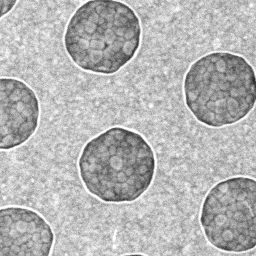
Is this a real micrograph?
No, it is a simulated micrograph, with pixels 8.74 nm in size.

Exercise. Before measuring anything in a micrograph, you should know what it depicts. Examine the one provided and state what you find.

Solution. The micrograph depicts holes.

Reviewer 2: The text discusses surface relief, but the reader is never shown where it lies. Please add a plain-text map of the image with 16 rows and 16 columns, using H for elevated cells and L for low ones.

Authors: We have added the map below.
LHHHHLLLHHHHHHHH
HHHHLLLLLHHHHHHH
HHHHLLLLLHHHHHHH
HHHHLLLLHHHHHLLH
HHHHHHLHHHHHLLLL
LLHHHHHHHHHHLLLL
LLHHHHHHHHHHLLLL
LLHHHHHHHHHHLLLH
LLHHHHLLLHHHHHHH
HHHHHLLLLLHHHHHH
HHHHHLLLLLHHHHHH
HHHHHLLLLHHHHHLL
HHHHHHLLHHHHHLLL
LLHHHHHHHHHHHLLL
LLLHHHHHHHHHHLLL
LLLHHHHHHHHHHHLL